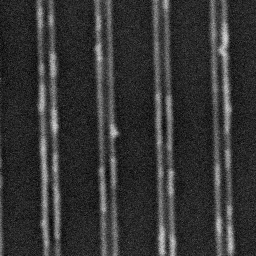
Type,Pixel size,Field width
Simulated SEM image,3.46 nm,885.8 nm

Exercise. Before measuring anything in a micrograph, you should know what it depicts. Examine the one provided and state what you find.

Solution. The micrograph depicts parallel lines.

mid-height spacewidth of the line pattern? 151 nm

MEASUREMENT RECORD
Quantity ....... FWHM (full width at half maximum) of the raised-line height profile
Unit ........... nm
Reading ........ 49.3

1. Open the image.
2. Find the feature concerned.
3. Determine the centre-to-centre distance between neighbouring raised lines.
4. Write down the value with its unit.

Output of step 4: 200 nm